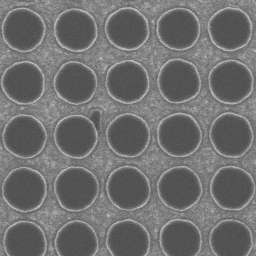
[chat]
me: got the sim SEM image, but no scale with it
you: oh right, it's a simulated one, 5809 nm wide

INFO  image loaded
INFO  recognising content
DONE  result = a regular array of raised bodies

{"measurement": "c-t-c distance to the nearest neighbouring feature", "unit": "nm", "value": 1170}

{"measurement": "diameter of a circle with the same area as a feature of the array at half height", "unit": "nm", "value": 986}